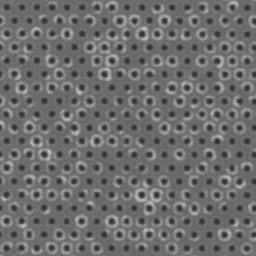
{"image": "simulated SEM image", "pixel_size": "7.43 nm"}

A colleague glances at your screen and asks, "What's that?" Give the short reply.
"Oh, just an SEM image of a regular array of holes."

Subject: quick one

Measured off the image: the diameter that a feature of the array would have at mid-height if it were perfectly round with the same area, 0.0524 micrometres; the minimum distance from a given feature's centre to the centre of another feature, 0.109 µm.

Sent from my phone